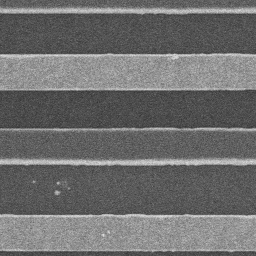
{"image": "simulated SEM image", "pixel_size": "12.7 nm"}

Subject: lines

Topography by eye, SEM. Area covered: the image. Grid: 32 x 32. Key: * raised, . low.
********************************
..**.**.........*********....*..
................................
................................
................................
................................
................................
********************************
********************************
********************************
********************************
................................
................................
................................
................................
................................
********************************
********************************
********************************
********************************
................................
................................
................................
................................
................................
................................
................................
********************************
********************************
********************************
********************************
................................